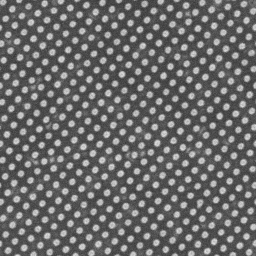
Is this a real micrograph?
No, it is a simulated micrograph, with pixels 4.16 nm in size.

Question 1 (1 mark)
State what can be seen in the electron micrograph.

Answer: a regular array of raised bodies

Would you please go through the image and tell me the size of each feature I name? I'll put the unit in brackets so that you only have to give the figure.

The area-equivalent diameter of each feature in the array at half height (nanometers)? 23.5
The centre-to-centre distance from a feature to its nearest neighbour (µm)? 0.0472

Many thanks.